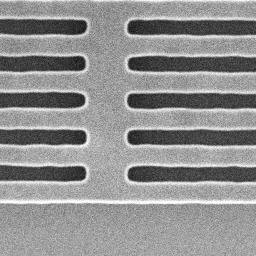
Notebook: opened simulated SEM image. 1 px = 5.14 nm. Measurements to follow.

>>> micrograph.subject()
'groups of lines, slits or small figures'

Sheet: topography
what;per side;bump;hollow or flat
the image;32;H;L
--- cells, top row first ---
HHHHHHHHHHHHHHHHHHHHHHHHHHHHHHHH
HHHHHHHHHHHHHHHHHHHHHHHHHHHHHHHH
LLLLLLLLLLHHHHHHHLLLLLHHLLLLLLLH
LLLLLLLLLLLHHHHHLLLLLLLLLLLLLLLL
HHLLHHHHHHHHHHHHHHLHHLHHLLLLLLLL
HHHHHHHHHHHHHHHHHHHHHHHHHHHHHHHH
HHHHHHHHHHHHHHHHHHHHHHHHHHHHHHHH
LLLLLLLLLLLHHHHHLLLLLLLLLLLLLLLL
LLLLLLLLLLLHHHHHLLLLLLLLLLLLLLLL
HHHHHHHHHHHHHHHHHHHHHHHHHHHHHHHH
HHHHHHHHHHHHHHHHHHHHHHHHHHHHHHHH
LLLLLLLLLHHHHHHHHHHHLLHHHLLHHHHH
LLLLLLLLLLLHHHHHLLLLLLLLLLLLLLLL
LHHLLLLLLHHHHHHHLLLLLLLLLLLLLLLL
HHHHHHHHHHHHHHHHHHHHHHHHHHHHHHHH
HHHHHHHHHHHHHHHHHHHHHHHHHHHHHHHH
LLLLLLLLLLLHHHHHLLLLLLLLLLLLLLLL
LLLLLLLLLLLHHHHHLLLLLLLLLLLLLLLL
HHHHHHHHHHHHHHHHHHHHHHHHHHHHHHHH
HHHHHHHHHHHHHHHHHHHHHHHHHHHHHHHH
HHHHHHHHHHHHHHHHHHHHHHHHHHHHHHHH
LLLLLLLLLLLHHHHHLLLLLLLLLLLLLLLL
LLLLLLLLLLHHHHHHLLLLLLLLLLLLLLLL
HHHHHHHHHHHHHHHHHHHHHHHHHHHHHHHH
HHHHHHHHHHHHHHHHHHHHHHHHHHHHHHHH
LLLLLLLLLLLLLLLLLLLLLLLLLLLLLLLL
LLLLLLLLLLLLLLLLLLLLLLLLLLLLLLLL
LLLLLLLLLLLLLLLLLLLLLLLLLLLLLLLL
LLLLLLLLLLLLLLLLLLLLLLLLLLLLLLLL
LLLLLLLLLLLLLLLLLLLLLLLLLLLLLLLL
LLLLLLLLLLLLLLLLLLLLLLLLLLLLLLLL
LLLLLLLLLLLLLLLLLLLLLLLLLLLLLLLL